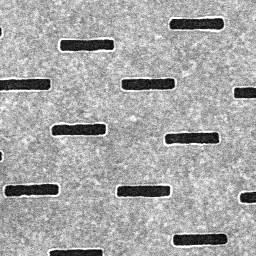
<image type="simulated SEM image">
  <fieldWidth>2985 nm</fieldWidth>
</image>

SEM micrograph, a regular array of holes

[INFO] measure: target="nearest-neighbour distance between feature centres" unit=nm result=851